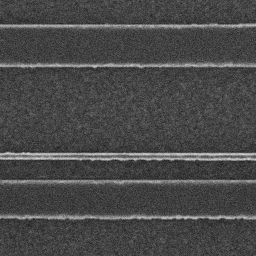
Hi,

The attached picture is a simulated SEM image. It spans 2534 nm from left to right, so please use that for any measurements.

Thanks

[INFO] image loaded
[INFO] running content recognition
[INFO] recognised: lines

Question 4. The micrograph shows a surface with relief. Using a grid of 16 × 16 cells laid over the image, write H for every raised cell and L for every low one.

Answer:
LLLLLLLLLLLLLLLL
LLLLLLLLLLLLLLLL
HHHHHHHHHHHHHHHH
HHHHHHHHHHHHHHHH
LLLLLLLLLLLLLLLL
LLLLLLLLLLLLLLLL
LLLLLLLLLLLLLLLL
LLLLLLLLLLLLLLLL
LLLLLLLLLLLLLLLL
LLLLLLLLLLLLLLLL
LLLLLLLLLLLLLLLL
HHHHHHHHHHHHHHHH
HHHHHHHHHHHHHHHH
HHHHHHHHHHHHHHHH
LLLLLLLLLLLLLLLL
LLLLLLLLLLLLLLLL